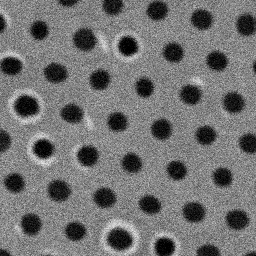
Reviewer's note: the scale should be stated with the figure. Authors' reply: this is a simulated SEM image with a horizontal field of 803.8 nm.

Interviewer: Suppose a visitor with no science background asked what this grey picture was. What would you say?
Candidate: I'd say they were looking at a regular array of holes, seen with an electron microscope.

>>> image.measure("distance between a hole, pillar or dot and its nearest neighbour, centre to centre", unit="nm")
137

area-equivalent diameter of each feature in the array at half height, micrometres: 0.0676